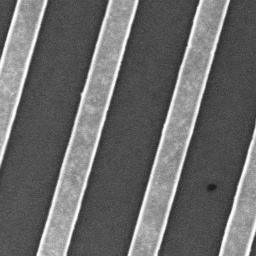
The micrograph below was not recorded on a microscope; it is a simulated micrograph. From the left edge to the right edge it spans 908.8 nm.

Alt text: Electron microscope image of one or a few lines or trenches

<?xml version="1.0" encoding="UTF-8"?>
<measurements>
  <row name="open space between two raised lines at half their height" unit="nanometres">218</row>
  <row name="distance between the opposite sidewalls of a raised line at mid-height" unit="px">26.2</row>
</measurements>